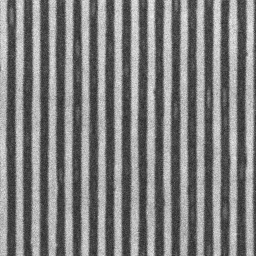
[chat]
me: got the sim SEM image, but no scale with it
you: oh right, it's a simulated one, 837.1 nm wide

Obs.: parallel lines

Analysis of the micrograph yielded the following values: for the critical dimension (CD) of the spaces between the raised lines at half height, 8.9 px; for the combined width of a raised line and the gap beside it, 53.7 nm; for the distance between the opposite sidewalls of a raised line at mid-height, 22.9 nanometres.